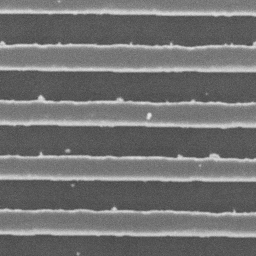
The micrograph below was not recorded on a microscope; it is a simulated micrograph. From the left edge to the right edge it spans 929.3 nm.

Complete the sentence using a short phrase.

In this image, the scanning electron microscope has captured lines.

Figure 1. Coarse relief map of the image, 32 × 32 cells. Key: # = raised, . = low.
################################
################################
................................
................................
................................
....#...........................
################################
################################
################################
................................
................................
................................
................................
################################
################################
################################
................................
................................
................................
................................
################################
################################
..........#..###################
................................
................................
................................
#########################.......
################################
################################
.............................##.
................................
................................